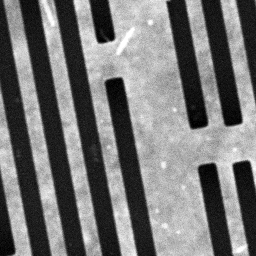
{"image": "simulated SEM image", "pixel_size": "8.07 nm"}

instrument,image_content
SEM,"groups of lines, slits or small figures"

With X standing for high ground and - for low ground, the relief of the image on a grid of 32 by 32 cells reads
-X---XX--XX---XXXXXXX--XX---XX--
-XX--XX--XX---XXXXXXX--XX---XX--
-XX--XX---XX--XXXXXXX---XX--XX--
-XX---X---XX--XXXXXXX---XX--XX--
-XX---XX--XX--XXXXXXXX--XX--XX--
-XX---XX--XXXXXXXXXXXX--XX---X--
--XX--XX--XXXXXXXXXXXX--XX---XX-
--XX--XX---XXXXXXXXXXX---X---XX-
--XX--XX---XXXXXXXXXXX---XX--XX-
--XX---XX--XXXXXXXXXXXX--XX--XX-
--XX---XX--XX---XXXXXXX--XX--XX-
---XX--XX--XX---XXXXXXX--XX---XX
---XX--XX---X---XXXXXXX---X---XX
---XX--XX---XX--XXXXXXX---XX--XX
X--XX---X---XX--XXXXXXX---XX--XX
X--XX---XX--XX---XXXXXXX--XX--XX
X---X---XX--XX---XXXXXXXXXXXXXXX
X---XX--XX--XX---XXXXXXXXXXXXXXX
X---XX--XX---XX--XXXXXXXXXXXXXXX
XX--XX---X---XX--XXXXXXXXXXXXXXX
XX--XX---XX--XX--XXXXXXXX--XX--X
XX--XX---XX--XX---XXXXXXX--XX---
XX---XX--XX--XX---XXXXXXX--XX---
XX---XX--XX---XX--XXXXXXX---X---
-XX--XX--XX---XX--XXXXXXX---XX--
-XX--XX---XX--XX--XXXXXXXX--XX--
-XX--XX---XX--XX---XXXXXXX--XX--
-XX---XX--XX--XX---XXXXXXX--XX--
-XX---XX--XX---X---XXXXXXX---X--
--X---XX--XX---XX--XXXXXXX---XX-
--XX--XX---X---XX--XXXXXXX---XX-
--XX--XX---XX--XX---XXXXXXX--XX-